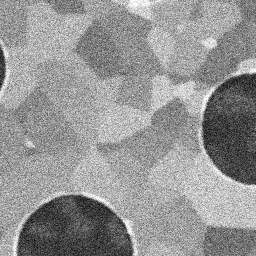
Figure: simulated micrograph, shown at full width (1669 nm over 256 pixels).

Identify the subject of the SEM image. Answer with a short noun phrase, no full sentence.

holes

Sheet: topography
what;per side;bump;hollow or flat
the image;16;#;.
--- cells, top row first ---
################
################
################
################
################
##############..
#############...
#############...
#############...
#############...
##############..
###############.
###...##########
##.....#########
#.......########
#.......########